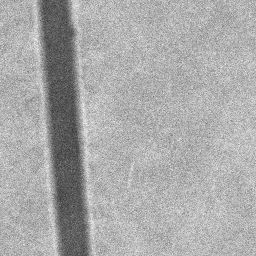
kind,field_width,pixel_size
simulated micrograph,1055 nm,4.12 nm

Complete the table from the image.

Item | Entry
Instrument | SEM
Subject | one or a few lines or trenches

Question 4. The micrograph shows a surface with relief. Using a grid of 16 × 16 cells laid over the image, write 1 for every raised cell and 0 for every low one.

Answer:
1100111111111111
1110011111111111
1110011111111111
1110011111111111
1110011111111111
1110011111111111
1110011111111111
1110011111111111
1110011111111111
1110011111111111
1110011111111111
1110011111111111
1110011111111111
1110011111111111
1111001111111111
1111001111111111